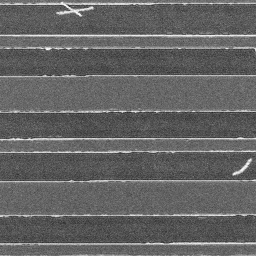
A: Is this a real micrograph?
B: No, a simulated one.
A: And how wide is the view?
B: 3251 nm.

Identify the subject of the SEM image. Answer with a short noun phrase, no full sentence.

lines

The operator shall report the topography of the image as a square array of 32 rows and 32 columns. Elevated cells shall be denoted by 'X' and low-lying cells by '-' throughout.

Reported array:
-------XX-----------------------
--------------------------------
--------------------------------
--------------------------------
XXXXXXXXXXXXXXXXXXXXXXXXXXXXXXXX
XXXXXXXXXXXXXXXXXXXXXXXXXXXXXXXX
--------------------------------
--------------------------------
--------------------------------
-----X--XXXXXXXXXXXXXXXXXXXXXXXX
XXXXXXXXXXXXXXXXXXXXXXXXXXXXXXXX
XXXXXXXXXXXXXXXXXXXXXXXXXXXXXXXX
XXXXXXXXXXXXXXXXXXXXXXXXXXXXXXXX
XXXXXXXXXXXXXXXXXXXXXXXXXXXXXXXX
--------------------------------
--------------------------------
--------------------------------
XXXXXXXXXXXXXXXXXXXXXXXXXXXXXXXX
XXXXXXXXXXXXXXXXXXXXXXXXXXXXXXXX
--------------------------------
--------------------------------
--------------------------------
--------------------------------
XXXXXXXXXXXXXXXXXXXXXXXXXXXXXXXX
XXXXXXXXXXXXXXXXXXXXXXXXXXXXXXXX
XXXXXXXXXXXXXXXXXXXXXXXXXXXXXXXX
XXXXXXXXXXXXXXXXXXXXXXXXXXXXXXXX
--------------------------------
--------------------------------
--------------------------------
-------------------XXXXXXXXXXXXX
XXXXXXXXXXXXXXXXXXXXXXXXXXXXXXXX